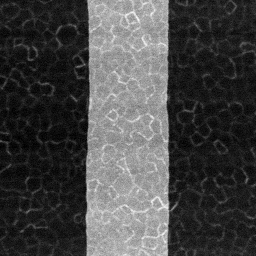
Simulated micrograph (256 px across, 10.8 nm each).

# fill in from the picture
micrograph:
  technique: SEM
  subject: one or a few lines or trenches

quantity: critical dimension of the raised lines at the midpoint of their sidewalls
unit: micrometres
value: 0.777